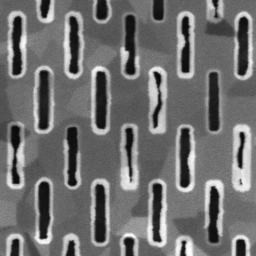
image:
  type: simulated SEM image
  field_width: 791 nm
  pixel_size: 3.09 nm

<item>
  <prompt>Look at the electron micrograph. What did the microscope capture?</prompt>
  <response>a regular array of holes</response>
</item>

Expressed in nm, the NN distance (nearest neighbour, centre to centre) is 176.